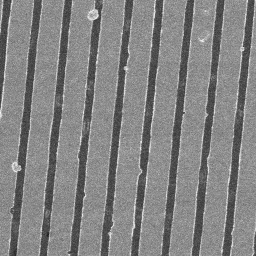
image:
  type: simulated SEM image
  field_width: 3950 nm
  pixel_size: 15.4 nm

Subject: parallel lines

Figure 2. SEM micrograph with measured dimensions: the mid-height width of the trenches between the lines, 129 nanometers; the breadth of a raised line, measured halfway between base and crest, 0.342 um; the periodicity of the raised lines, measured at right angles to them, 468 nm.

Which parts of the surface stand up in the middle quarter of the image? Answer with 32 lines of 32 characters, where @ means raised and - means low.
-@@@@@--@@@@@@-@@@@@@---@@@@@--@
@@@@@@--@@@@@--@@@@@@--@@@@@@--@
@@@@@@--@@@@@--@@@@@@--@@@@@@--@
@@@@@@--@@@@@--@@@@@@--@@@@@---@
@@@@@@--@@@@@--@@@@@@--@@@@@@--@
@@@@@---@@@@@--@@@@@@--@@@@@---@
@@@@@---@@@@@--@@@@@@--@@@@@--@@
@@@@@---@@@@@--@@@@@@--@@@@@--@@
@@@@@---@@@@@--@@@@@---@@@@@--@@
@@@@@--@@@@@@--@@@@@---@@@@@--@@
@@@@@--@@@@@@--@@@@@---@@@@@--@@
@@@@@--@@@@@---@@@@@---@@@@@--@@
@@@@@--@@@@@---@@@@@--@@@@@@--@@
@@@@@--@@@@@---@@@@@--@@@@@@--@@
@@@@@@-@@@@@--@@@@@@--@@@@@---@@
@@@@@@-@@@@@--@@@@@@--@@@@@--@@@
@@@@-@-@@@@@--@@@@@@--@@@@@--@@@
@@@@--@@@@@@--@@@@@---@@@@@--@@@
@@@@--@@@@@@--@@@@@---@@@@@--@@@
@@@@--@@@@@@--@@@@@---@@@@@--@@@
@@@@--@@@@@@--@@@@@---@@@@@--@@@
@@@@--@@@@@@--@@@@@--@@@@@@--@@@
@@@@--@@@@@---@@@@@--@@@@@@--@@@
@@@@--@@@@@---@@@@@--@@@@@@--@@@
@@@@--@@@@@--@@@@@@--@@@@@@--@@@
@@@---@@@@@--@@@@@@--@@@@@--@@@@
@@@---@@@@@--@@@@@@--@@@@@--@@@@
@@@---@@@@@--@@@@@@--@@@@@--@@@@
@@@--@@@@@@--@@@@@@--@@@@@--@@@@
@@@--@@@@@@--@@@@@---@@@@@--@@@@
@@@--@@@@@@--@@@@@---@@@@@--@@@@
@@@--@@@@@@--@@@@@--@@@@@@--@@@@